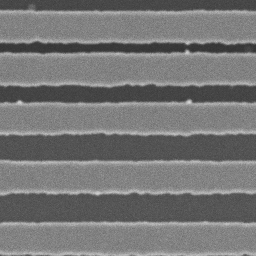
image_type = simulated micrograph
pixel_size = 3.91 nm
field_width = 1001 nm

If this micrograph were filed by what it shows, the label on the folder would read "lines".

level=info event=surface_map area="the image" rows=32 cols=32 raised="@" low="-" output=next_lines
--------------------------------
@@@@@@@@@@@@@@@@@@@@@@@@@@@@@@@@
@@@@@@@@@@@@@@@@@@@@@@@@@@@@@@@@
@@@@@@@@@@@@@@@@@@@@@@@@@@@@@@@@
@@@@@@@@@@@@@@@@@@@@@@@@@@@@@@@@
----------------------------@---
-----------------------@--------
@@@@@@@@@@@@@@@@@@@@@@@@@@@@@@@@
@@@@@@@@@@@@@@@@@@@@@@@@@@@@@@@@
@@@@@@@@@@@@@@@@@@@@@@@@@@@@@@@@
@@@@@@@@@@@@@@@@@@@@@@@@@@@@@@@@
--------------------------------
--------------------------------
@@@@@@@@@@@@@@@@@@@@@@@@@@@@@@@@
@@@@@@@@@@@@@@@@@@@@@@@@@@@@@@@@
@@@@@@@@@@@@@@@@@@@@@@@@@@@@@@@@
@@@@@@@@@@@@@@@@@@@@@@@@@@@@@@@@
--------------------------------
--------------------------------
--------------------------------
@@@@@@@@@@@@@@@@@@@@@@@@@@@@@@@@
@@@@@@@@@@@@@@@@@@@@@@@@@@@@@@@@
@@@@@@@@@@@@@@@@@@@@@@@@@@@@@@@@
@@@@@@@@@@@@@@@@@@@@@@@@@@@@@@@@
--------------------------------
--------------------------------
--------------------------------
--------------------------------
@@@@@@@@@@@@@@@@@@@@@@@@@@@@@@@@
@@@@@@@@@@@@@@@@@@@@@@@@@@@@@@@@
@@@@@@@@@@@@@@@@@@@@@@@@@@@@@@@@
@@@@@@@@@@@@@@@@@@@@@@@@@@@@@@@@